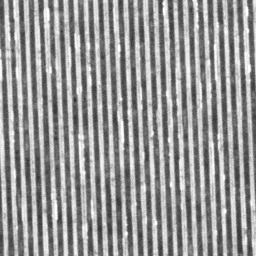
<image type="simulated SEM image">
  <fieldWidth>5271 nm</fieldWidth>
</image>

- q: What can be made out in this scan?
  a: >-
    parallel lines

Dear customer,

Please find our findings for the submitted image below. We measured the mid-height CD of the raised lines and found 54 nm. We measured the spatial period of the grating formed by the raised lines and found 9.94 px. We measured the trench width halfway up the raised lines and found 0.162 um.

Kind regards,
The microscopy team